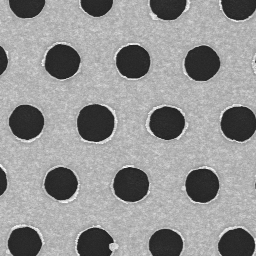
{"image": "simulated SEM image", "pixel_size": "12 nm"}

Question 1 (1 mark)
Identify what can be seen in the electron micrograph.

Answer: a regular array of holes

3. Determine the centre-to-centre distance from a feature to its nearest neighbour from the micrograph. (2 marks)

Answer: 828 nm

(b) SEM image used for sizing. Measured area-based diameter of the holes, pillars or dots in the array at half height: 0.426 microns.